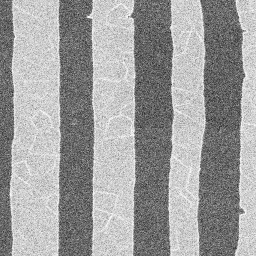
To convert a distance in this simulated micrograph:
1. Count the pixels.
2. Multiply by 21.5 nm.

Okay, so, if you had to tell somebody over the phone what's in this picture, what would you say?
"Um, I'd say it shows one or a few lines or trenches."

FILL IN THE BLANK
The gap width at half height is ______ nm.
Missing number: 808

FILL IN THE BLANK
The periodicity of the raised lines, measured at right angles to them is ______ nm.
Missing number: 1620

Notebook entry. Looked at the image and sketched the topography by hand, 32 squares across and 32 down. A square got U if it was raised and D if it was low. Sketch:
DDUUUUUDDDDDUUUUUDDDDDUUUDDDDDUU
DDUUUUUDDDDDUUUUDDDDDUUUUDDDDDUU
DDUUUUUDDDDUUUUUDDDDDDUUUDDDDDUU
DDUUUUUDDDDDUUUUUDDDDUUUUDDDDDUU
DDUUUUUDDDDDUUUUUDDDDDUUUDDDDDUU
DDUUUUUDDDDDUUUUUDDDDDUUUDDDDDUU
DDUUUUUDDDDDUUUUUDDDDDUUUUDDDDUU
DDUUUUUDDDDDUUUUUDDDDDUUUDDDDDUU
DDUUUUUDDDDDUUUUUDDDDDUUUDDDDDDU
DDUUUUUDDDDDUUUUUDDDDDUUUDDDDDDU
DDUUUUUDDDDDUUUUUDDDDDUUUDDDDDUU
DDUUUUUDDDDDUUUUUDDDDDUUUDDDDDUU
DDUUUUUDDDDDUUUUUDDDDDUUUDDDDDUU
DDUUUUUDDDDDUUUUUDDDDDUUUDDDDDUU
DDUUUUUDDDDDUUUUUDDDDDUUUUDDDDUU
DDUUUUUDDDDDUUUUUDDDDDUUUUDDDDUU
DDUUUUUDDDDDUUUUUDDDDDUUUDDDDDUU
DDUUUUUDDDDDUUUUUDDDDDUUUDDDDDUU
DDUUUUUDDDDDUUUUUDDDDDUUUDDDDDUU
DDUUUUUDDDDDUUUUUDDDDUUUUDDDDDUU
DDUUUUUDDDDDUUUUUDDDDUUUUDDDDDUU
DDUUUUUDDDDDUUUUUDDDDUUUUDDDDDUU
DUUUUUUDDDDDUUUUUDDDDUUUUDDDDDUU
DUUUUUUDDDDDUUUUUDDDDUUUUDDDDDUU
DUUUUUUDDDDDUUUUUDDDDUUUUDDDDDUU
DUUUUUUDDDDDUUUUUDDDDUUUUDDDDDUU
DUUUUUUDDDDDUUUUUDDDDUUUUDDDDDUU
DDUUUUUDDDDDUUUUUDDDDUUUUDDDDDUU
DDUUUUUDDDDDUUUUUDDDDUUUUDDDDDUU
DDUUUUUDDDDDUUUUUDDDDUUUUDDDDDUU
DDUUUUUDDDDDUUUUUDDDDUUUUDDDDDUU
DDUUUUUDDDDDUUUUUDDDDUUUUDDDDDUU